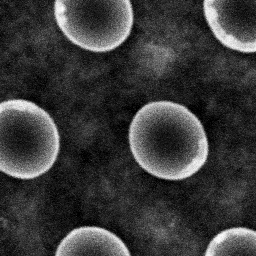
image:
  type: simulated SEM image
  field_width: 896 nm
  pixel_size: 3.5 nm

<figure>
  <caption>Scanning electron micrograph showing raised bodies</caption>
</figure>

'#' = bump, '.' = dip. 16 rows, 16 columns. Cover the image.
...#####.....###
....####.....###
.....###......##
................
................
................
##.......##.....
###.....####....
####....#####...
####....#####...
###......###....
................
................
................
.....##.......##
....####.....###